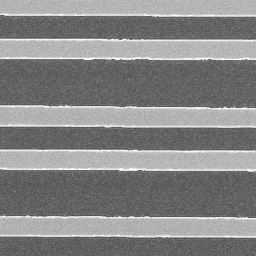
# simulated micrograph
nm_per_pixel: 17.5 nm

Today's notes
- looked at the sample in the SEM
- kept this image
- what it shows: lines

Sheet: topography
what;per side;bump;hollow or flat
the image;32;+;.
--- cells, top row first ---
++++++++++++++++++++++++++++++++
++++++++++++++++++++++++++++++++
................................
................................
................................
++++++++++++++++++++++++++++++++
++++++++++++++++++++++++++++++++
................................
................................
................................
................................
................................
................................
+++++++++++++++++++++++++++.+++.
++++++++++++++++++++++++++++++++
++++++++++++++++++++++++++++++++
................................
................................
................................
++++++++++++++++++++++++++++++++
++++++++++++++++++++++++++++++++
................................
................................
................................
................................
................................
................................
++++++++++++++++++++++++++++++++
++++++++++++++++++++++++++++++++
................++++++++++++++++
................................
................................